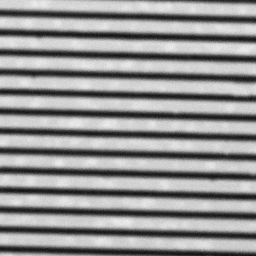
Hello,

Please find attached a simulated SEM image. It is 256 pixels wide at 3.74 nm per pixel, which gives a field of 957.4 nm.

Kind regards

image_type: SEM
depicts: parallel lines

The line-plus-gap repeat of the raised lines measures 73.5 nanometers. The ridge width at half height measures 46.2 nm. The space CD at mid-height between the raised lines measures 7.62 px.